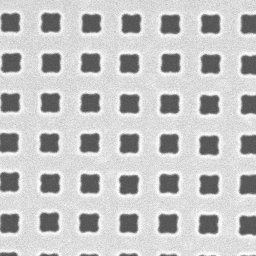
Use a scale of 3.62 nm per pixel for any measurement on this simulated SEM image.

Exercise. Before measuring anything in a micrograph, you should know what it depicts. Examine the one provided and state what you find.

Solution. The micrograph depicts a regular array of holes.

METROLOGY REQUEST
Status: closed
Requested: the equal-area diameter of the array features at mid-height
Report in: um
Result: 0.0786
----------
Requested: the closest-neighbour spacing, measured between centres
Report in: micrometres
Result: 0.143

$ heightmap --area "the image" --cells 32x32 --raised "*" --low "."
********************************
********************************
...**...**...**...**...**...**..
...**...**...**...**...**...**..
********************************
********************************
********************************
...**...**...**..***..***...**..
...**...**..***..***..***...**..
********************************
********************************
********************************
...**...**...**..***..***..***..
..***...**...**..***..***..***..
********************************
********************************
********************************
..***..***..***..***..***..***..
..***..***..***..***..***..***..
********************************
********************************
..******************************
..***..***..***..***..***..***..
..***..***..***..***..***..***..
********************************
********************************
********************************
..***..***..***..***..***..***..
..***..***..***..***..***..***..
********************************
********************************
********************************